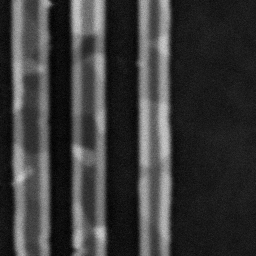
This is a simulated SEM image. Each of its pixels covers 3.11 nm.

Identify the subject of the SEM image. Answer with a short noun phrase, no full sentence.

one or a few lines or trenches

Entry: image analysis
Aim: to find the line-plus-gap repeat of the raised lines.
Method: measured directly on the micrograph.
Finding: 191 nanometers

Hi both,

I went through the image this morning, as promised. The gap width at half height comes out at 37.2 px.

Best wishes